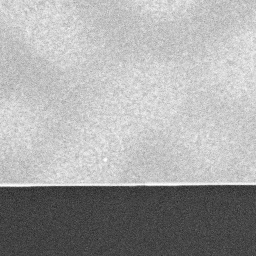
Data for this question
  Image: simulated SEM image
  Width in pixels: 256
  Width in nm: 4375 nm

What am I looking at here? wiring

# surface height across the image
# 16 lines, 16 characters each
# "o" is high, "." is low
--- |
oooooooooooooooo
oooooooooooooooo
oooooooooooooooo
oooooooooooooooo
oooooooooooooooo
oooooooooooooooo
oooooooooooooooo
oooooooooooooooo
oooooooooooooooo
oooooooooooooooo
oooooooooooooooo
oooooooooooooooo
................
................
................
................